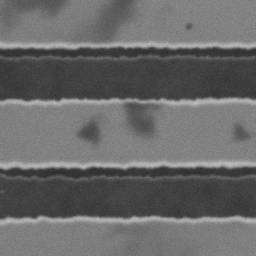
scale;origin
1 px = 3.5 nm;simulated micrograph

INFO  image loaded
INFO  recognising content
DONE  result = lines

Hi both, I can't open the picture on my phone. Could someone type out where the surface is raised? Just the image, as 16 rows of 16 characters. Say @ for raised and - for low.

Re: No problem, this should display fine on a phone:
@@@@@@@@@@@@@@@@
@@@@@@@@@@@@@@@@
@@@@@@@@@@@@@@@@
----------------
----------------
----------------
@@@@@@@@@@@@@@@@
@@@@@@@@@@@@@@@@
@@@@@@@@@@@@@@@@
@@@@@@@@@@@@@@@@
--@----@--------
----------------
----------------
----------------
@@@@@@@@@@@@@@@@
@@@@@@@@@@@@@@@@